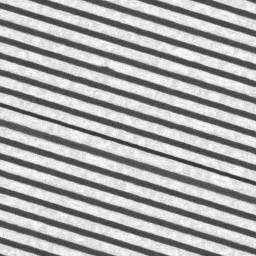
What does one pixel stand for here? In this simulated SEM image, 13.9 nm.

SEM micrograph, parallel lines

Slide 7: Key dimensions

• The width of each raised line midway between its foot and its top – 151 nanometres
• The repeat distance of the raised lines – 223 nm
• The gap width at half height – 76.5 nanometres